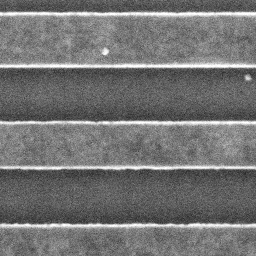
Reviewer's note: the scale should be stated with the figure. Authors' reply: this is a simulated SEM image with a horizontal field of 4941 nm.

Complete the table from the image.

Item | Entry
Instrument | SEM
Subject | lines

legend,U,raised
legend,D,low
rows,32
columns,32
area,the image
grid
DDDDDDDDDDDDDDDDDDDDDDDDDDDDDDDD
DDDDDDDDDDDDDDDDDDDDDDDDDDDDDDDD
UUUUUUUUUUUUUUUUUUUUUUUUUUUUUUUU
UUUUUUUUUUUUUUUUUUUUUUUUUUUUUUUU
UUUUUUUUUUUUUUUUUUUUUUUUUUUUUUUU
UUUUUUUUUUUUUUUUUUUUUUUUUUUUUUUU
UUUUUUUUUUUUUUUUUUUUUUUUUUUUUUUU
UUUUUUUUUUUUUUUUUUUUUUUUUUUUUUUU
DDDDDDDDDDDDDDDDDDDDDDDDDDDDDDDD
DDDDDDDDDDDDDDDDDDDDDDDDDDDDDDDD
DDDDDDDDDDDDDDDDDDDDDDDDDDDDDDDD
DDDDDDDDDDDDDDDDDDDDDDDDDDDDDDDD
DDDDDDDDDDDDDDDDDDDDDDDDDDDDDDDD
DDDDDDDDDDDDDDDDDDDDDDDDDDDDDDDD
DDDDDDDDDDDDDDDDDDDDDDDDDDDDDDDD
UUUUUUUUUUUUUUUUUUUUUUUUUUUUUUUU
UUUUUUUUUUUUUUUUUUUUUUUUUUUUUUUU
UUUUUUUUUUUUUUUUUUUUUUUUUUUUUUUU
UUUUUUUUUUUUUUUUUUUUUUUUUUUUUUUU
UUUUUUUUUUUUUUUUUUUUUUUUUUUUUUUU
UUUUUUUUUUUUUUUUUUUUUUUUUUUUUUUU
DDDDDDDDDDDDDDDDDDDDDDDDDDDDDDDD
DDDDDDDDDDDDDDDDDDDDDDDDDDDDDDDD
DDDDDDDDDDDDDDDDDDDDDDDDDDDDDDDD
DDDDDDDDDDDDDDDDDDDDDDDDDDDDDDDD
DDDDDDDDDDDDDDDDDDDDDDDDDDDDDDDD
DDDDDDDDDDDDDDDDDDDDDDDDDDDDDDDD
DDDDDDDDDDDDDDDDDDDDDDDDDDDDDDDD
UUUUUUUUUUUUUUUUUUUUUUUUUUUUUUUU
UUUUUUUUUUUUUUUUUUUUUUUUUUUUUUUU
UUUUUUUUUUUUUUUUUUUUUUUUUUUUUUUU
UUUUUUUUUUUUUUUUUUUUUUUUUUUUUUUU